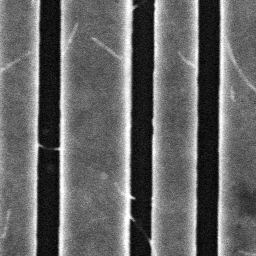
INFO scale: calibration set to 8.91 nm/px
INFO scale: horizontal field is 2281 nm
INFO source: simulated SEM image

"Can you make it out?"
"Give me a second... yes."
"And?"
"lines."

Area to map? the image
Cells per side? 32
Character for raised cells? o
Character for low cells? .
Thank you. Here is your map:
ooooo...oooooooo...oooooo...oooo
ooooo...ooooooooo..oooooo...oooo
ooooo...oooooooo...oooooo...oooo
ooooo...oooooooo...oooooo...oooo
ooooo...oooooooo...oooooo...oooo
ooooo...oooooooo...oooooo...oooo
ooooo...oooooooo...oooooo...oooo
ooooo...oooooooo...oooooo...oooo
ooooo...oooooooo...oooooo...oooo
ooooo...oooooooo...oooooo...oooo
ooooo...oooooooo...oooooo...oooo
ooooo...oooooooo...oooooo..ooooo
ooooo...oooooooo...oooooo..ooooo
ooooo...oooooooo...oooooo..ooooo
ooooo...oooooooo...oooooo..ooooo
ooooo...oooooooo...oooooo..ooooo
ooooo...oooooooo...oooooo..ooooo
ooooo...oooooooo...oooooo..ooooo
ooooo..ooooooooo...oooooo..ooooo
ooooo...oooooooo...oooooo..ooooo
ooooo...oooooooo...oooooo..ooooo
ooooo...oooooooo...ooooo...ooooo
ooooo...oooooooo...oooooo..ooooo
ooooo...oooooooo...ooooo...ooooo
ooooo...oooooooo...ooooo...ooooo
ooooo...oooooooo...oooooo..ooooo
ooooo...oooooooo...ooooo...ooooo
ooooo...oooooooo...ooooo...ooooo
ooooo...oooooooo...ooooo...ooooo
ooooo...oooooooo...ooooo...ooooo
ooooo..ooooooooo...ooooo...ooooo
oooo...ooooooooo...ooooo...ooooo